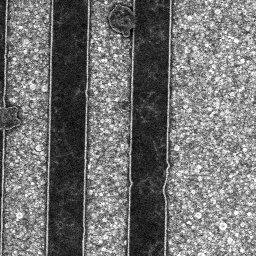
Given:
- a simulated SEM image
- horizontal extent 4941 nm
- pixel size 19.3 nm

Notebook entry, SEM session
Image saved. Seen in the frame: one or a few lines or trenches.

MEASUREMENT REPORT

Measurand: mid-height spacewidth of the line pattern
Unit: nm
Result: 873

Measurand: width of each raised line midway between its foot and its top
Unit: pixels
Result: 36.4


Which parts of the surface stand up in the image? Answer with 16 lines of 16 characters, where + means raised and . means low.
...+++.++++.....
...++..++++.....
...++...+++.....
...++...+++.....
...++...+++.....
...++...+++.....
...++...+++.....
+..++...++......
...++...++......
...++...++......
...++...++......
...++...++......
...++...++......
...++...++......
...++...++......
...++...++......